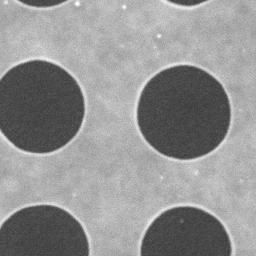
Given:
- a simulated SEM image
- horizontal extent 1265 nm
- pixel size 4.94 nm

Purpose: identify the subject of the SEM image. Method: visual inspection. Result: holes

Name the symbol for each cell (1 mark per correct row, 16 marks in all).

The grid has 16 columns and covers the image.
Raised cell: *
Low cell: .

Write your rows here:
****************
****************
****************
****************
....******...***
.....****.....**
.....****.....**
.....****.....**
.....****.....**
**.*******...***
****************
****************
****************
*....*****...***
.....****.....**
......***.....**